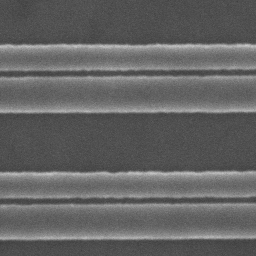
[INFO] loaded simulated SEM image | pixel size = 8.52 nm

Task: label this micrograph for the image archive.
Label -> lines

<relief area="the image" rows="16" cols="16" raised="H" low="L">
LLLLLLLLLLLLLLLL
LLLLLLLLLLLLLLLL
LLLLLLLLLLLLLLLL
HHHHHHHHHHHHHHHH
HHHHHHHHHHHHHHHH
HHHHHHHHHHHHHHHH
HHHHHHHHHHHHHHHH
LLLLLLLLLLLLLLLL
LLLLLLLLLLLLLLLL
LLLLLLLLLLLLLLLL
LLLLLLLLLLLLLLLL
HHHHHHHHHHHHHHHH
HHHHHHHHHHHHHHHH
HHHHHHHHHHHHHHHH
HHHHHHHHHHHHHHHH
LLLLLLLLLLLLLLLL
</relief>